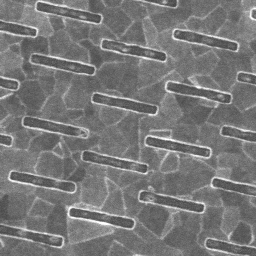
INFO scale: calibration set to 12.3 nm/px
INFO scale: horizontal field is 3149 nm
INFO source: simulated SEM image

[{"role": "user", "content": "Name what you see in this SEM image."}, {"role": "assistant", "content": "a regular array of holes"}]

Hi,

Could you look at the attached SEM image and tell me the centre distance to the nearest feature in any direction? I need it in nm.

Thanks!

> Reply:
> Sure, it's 677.